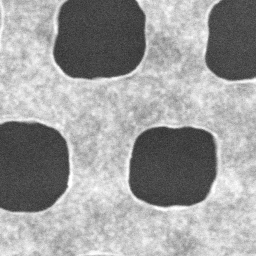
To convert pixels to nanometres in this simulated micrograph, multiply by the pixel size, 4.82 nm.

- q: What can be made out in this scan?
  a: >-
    holes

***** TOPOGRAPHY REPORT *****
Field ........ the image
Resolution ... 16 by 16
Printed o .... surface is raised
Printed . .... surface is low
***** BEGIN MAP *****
oooo.....oooo...
oooo.....oooo...
ooo......oooo...
ooo......oooo...
oooo....ooooo...
oooooooooooooooo
oooooooooooooooo
oooooooooooooooo
....ooooo....ooo
....oooo......oo
....oooo......oo
....oooo.....ooo
....ooooo....ooo
oooooooooooooooo
oooooooooooooooo
oooooooooooooooo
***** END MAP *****